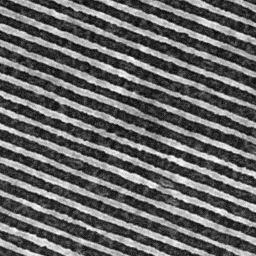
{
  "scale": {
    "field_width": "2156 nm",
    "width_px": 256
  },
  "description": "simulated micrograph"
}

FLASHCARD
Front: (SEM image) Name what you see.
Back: parallel lines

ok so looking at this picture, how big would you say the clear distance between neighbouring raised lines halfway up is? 91.3 nm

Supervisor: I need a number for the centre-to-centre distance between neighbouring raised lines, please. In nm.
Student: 131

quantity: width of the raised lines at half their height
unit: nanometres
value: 38.3